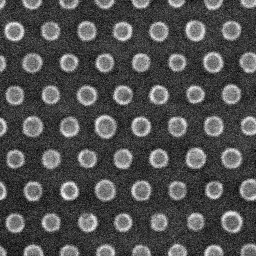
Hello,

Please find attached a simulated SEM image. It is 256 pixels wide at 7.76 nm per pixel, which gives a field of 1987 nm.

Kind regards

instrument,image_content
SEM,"a regular array of raised bodies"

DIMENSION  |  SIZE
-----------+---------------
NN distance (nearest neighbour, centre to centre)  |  279 nm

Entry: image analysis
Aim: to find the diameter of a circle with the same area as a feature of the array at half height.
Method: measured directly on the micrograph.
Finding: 0.13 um